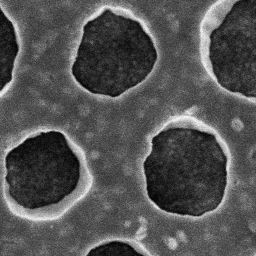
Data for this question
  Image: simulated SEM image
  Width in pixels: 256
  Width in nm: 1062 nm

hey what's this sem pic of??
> holes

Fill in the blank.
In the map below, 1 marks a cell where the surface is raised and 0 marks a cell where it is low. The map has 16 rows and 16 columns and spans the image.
1111111111111100
0111100001111000
0111100001111000
0111100000111000
0111100001111000
1111100011111100
1111111111111111
1111111111111111
1100111111000111
1000011110000011
0000011110000011
0000011110000011
1000111110000011
1111111111111111
1111111111111111
1111110001111111